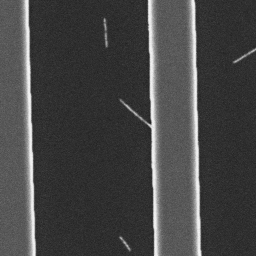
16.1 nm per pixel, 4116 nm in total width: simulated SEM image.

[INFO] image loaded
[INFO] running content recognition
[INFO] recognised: lines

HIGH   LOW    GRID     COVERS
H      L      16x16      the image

HHLLLLLLLHHHLLLL
HHLLLLLLLHHHLLLL
HHLLLLLLLHHHLLLL
HHLLLLLLLHHHLLLL
HHLLLLLLLHHHLLLL
HHLLLLLLLHHHLLLL
HHLLLLLLLHHHLLLL
HHLLLLLLLHHHLLLL
HHLLLLLLLLHHLLLL
HHLLLLLLLLHHLLLL
HHLLLLLLLLHHLLLL
HHLLLLLLLLHHLLLL
HHLLLLLLLLHHLLLL
HHLLLLLLLLHHLLLL
HHLLLLLLLLHHLLLL
HHLLLLLLLLHHLLLL